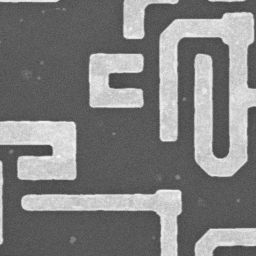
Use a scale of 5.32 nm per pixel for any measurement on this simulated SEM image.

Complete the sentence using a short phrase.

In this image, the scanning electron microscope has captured wiring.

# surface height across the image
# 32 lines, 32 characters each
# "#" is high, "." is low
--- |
................###.............
................##..............
................##....##########
................##...###########
................##..############
....................##......###.
....................##.......##.
...........#######..##..##...##.
...........#######..##..##...##.
...........###......##..##...##.
...........###......##..##...##.
...........#######..##..##...###
...........#######..##..##...###
....................##..##...##.
....................##..##...##.
#########...........##..##...##.
#########...........##..##...##.
#########...........##..##...##.
.......##...............##...##.
......###...............###.###.
..#######................#####..
..#######.................###...
................................
................................
...######.#############.........
...####################.........
....................###.........
....................##..........
....................##..........
....................##...#######
....................##..########
....................##..###.....